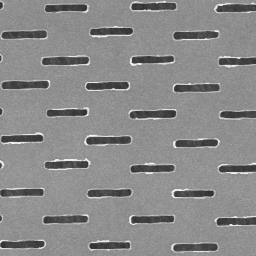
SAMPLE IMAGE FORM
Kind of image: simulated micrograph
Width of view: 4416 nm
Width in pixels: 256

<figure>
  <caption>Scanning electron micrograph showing a regular array of holes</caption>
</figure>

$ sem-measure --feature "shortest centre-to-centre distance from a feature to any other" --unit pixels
49.1